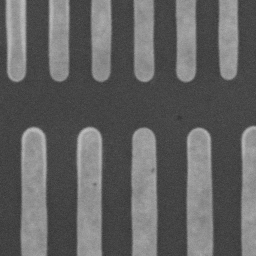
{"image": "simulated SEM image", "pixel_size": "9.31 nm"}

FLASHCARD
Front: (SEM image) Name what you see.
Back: groups of lines, slits or small figures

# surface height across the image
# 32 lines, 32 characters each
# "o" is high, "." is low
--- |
.oo...oo....oo...oo...oo...ooo..
.oo...oo....oo...oo...oo...ooo..
.oo...oo...ooo...oo...oo...ooo..
.oo...oo...ooo...oo...oo...ooo..
.oo...oo....oo...oo...oo...ooo..
.oo...oo....oo...oo...oo...ooo..
.oo...oo....oo...oo...oo...ooo..
.oo...oo....oo...oo...oo....oo..
.oo...oo....oo...oo...oo....oo..
.oo...oo....oo...oo...oo....o...
................................
................................
................................
................................
................................
................................
...oo.....oo.....oo.....oo.....o
...oo.....ooo....oo.....oo....oo
...ooo....ooo....oo.....oo....oo
...ooo....ooo....oo.....oo....oo
...ooo....ooo....oo.....oo....oo
...ooo....ooo....oo.....oo....oo
...ooo....ooo....oo.....oo....oo
...ooo....ooo....oo....ooo....oo
...ooo....ooo....oo....ooo....oo
...ooo....ooo....oo....ooo....oo
...ooo....ooo....ooo...oooo...oo
...ooo....ooo....oo....oooo...oo
...ooo....ooo....oo....oooo...oo
...ooo....ooo....oo....oooo...oo
...ooo....ooo....oo....oooo...oo
...ooo....ooo....oo....oooo...oo